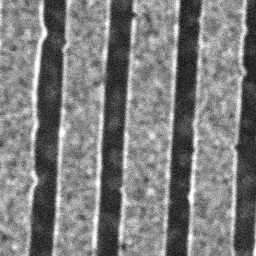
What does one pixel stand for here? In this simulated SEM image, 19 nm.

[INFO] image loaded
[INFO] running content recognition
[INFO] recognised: one or a few lines or trenches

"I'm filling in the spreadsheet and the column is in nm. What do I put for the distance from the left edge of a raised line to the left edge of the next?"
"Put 1280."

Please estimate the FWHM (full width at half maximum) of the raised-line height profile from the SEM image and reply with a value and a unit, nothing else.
803 nanometres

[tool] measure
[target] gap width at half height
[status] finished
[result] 0.476 micrometres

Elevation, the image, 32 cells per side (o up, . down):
ooooo...oooooo...ooooo...oooooo.
ooooo...oooooo...ooooo...ooooo..
ooooo...ooooo....ooooo...ooooo..
ooooo...ooooo....ooooo...oooooo.
oooooo..ooooo....ooooo...ooooo..
ooooo...ooooo....ooooo...ooooo..
ooooo...ooooo....ooooo...ooooo..
ooooo...ooooo...oooooo...ooooo..
ooooo...ooooo...oooooo...ooooo..
ooooo...ooooo...oooooo...ooooo..
oooo....ooooo...oooooo...ooooo..
oooo....ooooo...oooooo...ooooo..
oooo....ooooo...oooooo...ooooo..
oooo....ooooo...oooooo...ooooo..
oooo....ooooo...ooooo....ooooo..
ooooo...ooooo...ooooo...oooooo..
oooo....ooooo...ooooo...oooooo..
oooo....oooo....ooooo...oooooo..
oooo...ooooo....ooooo...ooooo...
oooo...ooooo....ooooo...ooooo...
oooo...oooooo...ooooo...ooooo...
oooo...ooooo....ooooo...ooooo...
oooo...ooooo....ooooo...ooooo...
oooo...ooooo...oooooo...ooooo...
oooo...ooooo...oooooo...ooooo...
oooo...ooooo...oooooo...ooooo...
oooo...ooooo...oooooo...ooooo...
oooo...ooooo...oooooo...ooooo...
oooo...ooooo...oooooo...ooooo...
oooo...ooooo...oooooo...ooooo...
oooo...ooooo...oooooo...ooooo...
ooo....ooooo...ooooo....ooooo...